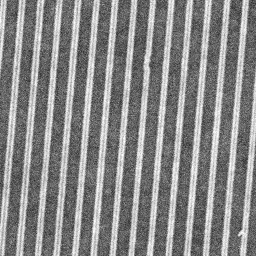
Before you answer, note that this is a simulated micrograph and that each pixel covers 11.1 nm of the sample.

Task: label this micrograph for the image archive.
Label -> parallel lines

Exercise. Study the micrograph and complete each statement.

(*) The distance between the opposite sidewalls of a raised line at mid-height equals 41.4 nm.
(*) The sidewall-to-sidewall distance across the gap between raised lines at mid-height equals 14.1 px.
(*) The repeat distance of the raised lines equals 206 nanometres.